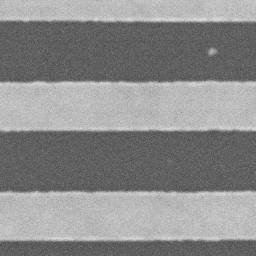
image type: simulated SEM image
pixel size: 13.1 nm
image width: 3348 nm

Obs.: lines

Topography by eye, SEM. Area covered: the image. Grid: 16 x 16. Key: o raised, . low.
oooooooooooooooo
................
................
................
................
oooooooooooooooo
oooooooooooooooo
oooooooooooooooo
................
................
................
................
oooooooooooooooo
oooooooooooooooo
oooooooooooooooo
................